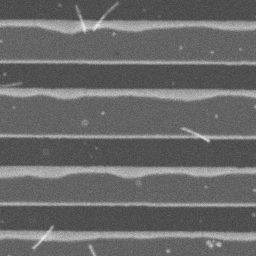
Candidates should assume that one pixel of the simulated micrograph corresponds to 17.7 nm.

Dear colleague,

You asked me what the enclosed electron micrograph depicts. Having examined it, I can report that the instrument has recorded lines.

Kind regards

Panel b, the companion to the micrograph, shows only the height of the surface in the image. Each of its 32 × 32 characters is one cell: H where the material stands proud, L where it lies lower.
LLLLLLLLLLLLLLLLLLLLLLLLLLLLLLLL
LLLLLLLLLLLLLLLLLLLLLLLLLLLLLLLL
LLLLLLLLLLLLLLLLLLLLLLLLLLLLLLLL
HHHHHHHHHHHHHHHHHHHHHHHHHHHHHHHH
HHHHHHHHHHHHHHHHHHHHHHHHHHHHHHHH
HHHHHHHHHHHHHHHHHHHHHHHHHHHHHHHH
HHHHHHHHHHHHHHHHHHHHHHHHHHHHHHHH
HHHHHHHHHHHHHHHHHHHHHHHHHHHHHHHH
LLLLLLLLLLLLLLLLLLLLLLLLLLLLLLLL
LLLLLLLLLLLLLLLLLLLLLLLLLLLLLLLL
LLLLLLLLLLLLLLLLLLLLLLLLLLLLLLLL
HHLHHHHLLLLLLLLHHLLLLLLLLLLLLLLL
HHHHHHHHHHHHHHHHHHHHHHHHHHHHHHHH
HHHHHHHHHHHHHHHHHHHHHHHHHHHHHHHH
HHHHHHHHHHHHHHHHHHHHHHHHHHHHHHHH
HHHHHHHHHHHHHHHHHHHHHHHHHHHHHHHH
HHHHHHHHHHHHHHHHHHHHHHHHHHHHHHHH
LLLLLLLLLLLLLLLLLLLLLLLLLLLLLLLL
LLLLLLLLLLLLLLLLLLLLLLLLLLLLLLLL
LLLLLLLLLLLLLLLLLLLLLLLLLLLLLLLL
LLLLLLLLLLLLLLLLLLLLLLLLLLLLLLLL
HHHHHHHHHHHHHHHHHHHHHHHHHHHHHHHH
HHHHHHHHHHHHHHHHHHHHHHHHHHHHHHHH
HHHHHHHHHHHHHHHHHHHHHHHHHHHHHHHH
HHHHHHHHHHHHHHHHHHHHHHHHHHHHHHHH
HHHHHHHHHHHHHHHHHHHHHHHHHHHHHHHH
LLLLLLLLLLLLLLLLLLLLLLLLLLLLLLLL
LLLLLLLLLLLLLLLLLLLLLLLLLLLLLLLL
LLLLLLLLLLLLLLLLLLLLLLLLLLLLLLLL
HHHHHHHHHHHHHHHHHHHHHHHHHHHHHHHH
HHHHHHHHHHHHHHHHHHHHHHHHHHHHHHHH
HHHHHHHHHHHHHHHHHHHHHHHHHHHHHHHH